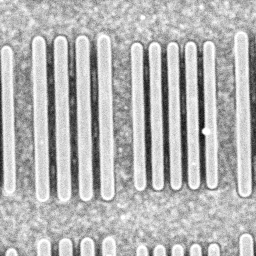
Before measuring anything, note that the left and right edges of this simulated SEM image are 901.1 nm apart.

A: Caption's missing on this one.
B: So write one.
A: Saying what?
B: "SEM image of groups of lines, slits or small figures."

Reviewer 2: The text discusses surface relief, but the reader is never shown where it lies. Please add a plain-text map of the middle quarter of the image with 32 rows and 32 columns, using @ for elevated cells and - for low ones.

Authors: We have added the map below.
@--@@@---@@@-----@@---@@--@@---@
@--@@@---@@@-----@@---@@--@@---@
@--@@@---@@@-----@@---@@--@@---@
@--@@@---@@@-----@@@--@@--@@---@
@--@@@---@@@-----@@@--@@--@@---@
@--@@@---@@@-----@@@--@@--@@@--@
@--@@@---@@@-----@@@--@@--@@@--@
@--@@@---@@@-----@@@--@@--@@@--@
@--@@@---@@@-----@@@--@@--@@@--@
@--@@@---@@@-----@@@--@@--@@@--@
@--@@@---@@@-----@@@--@@--@@@--@
@--@@@---@@@-----@@@--@@--@@@--@
@---@@---@@@-----@@@--@@--@@@--@
@---@@@--@@@-----@@@--@@--@@@--@
@---@@@--@@@-----@@@--@@--@@@--@
@---@@@--@@@------@@--@@--@@@--@
@---@@@--@@@------@@--@@--@@@--@
@---@@@--@@@------@@--@@---@@--@
@---@@@--@@@------@@--@@---@@--@
@---@@@--@@@------@@--@@---@@--@
@---@@@--@@@------@@--@@---@@--@
@---@@@--@@@------@@--@@@--@@--@
@---@@@--@@@------@@--@@@--@@--@
@---@@@--@@@------@@--@@@--@@--@
@---@@@--@@@------@@--@@@--@@--@
@---@@@--@@@------@@--@@@--@@--@
@---@@@--@@@------@@--@@@--@@--@
@---@@@--@@@------@@--@@@--@@--@
@---@@@--@@@------@@--@@@--@@--@
@---@@@--@@@------@@--@@@--@@--@
@---@@@--@@@------@@--@@@--@@--@
@---@@@--@@@--------------------